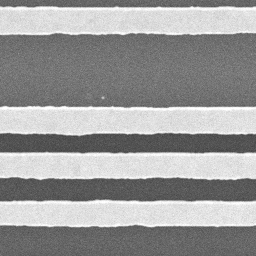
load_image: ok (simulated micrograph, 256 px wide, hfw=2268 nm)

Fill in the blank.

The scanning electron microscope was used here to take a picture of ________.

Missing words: lines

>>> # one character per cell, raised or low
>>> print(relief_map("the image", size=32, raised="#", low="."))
................................
################################
################################
################################
................................
................................
................................
................................
................................
................................
................................
................................
................................
################.#...###########
################################
################################
################################
................................
................................
################################
################################
################################
................................
................................
................................
################################
################################
################################
................................
................................
................................
................................